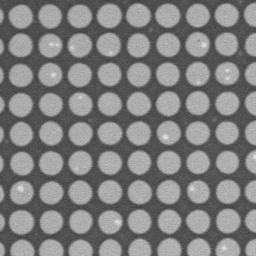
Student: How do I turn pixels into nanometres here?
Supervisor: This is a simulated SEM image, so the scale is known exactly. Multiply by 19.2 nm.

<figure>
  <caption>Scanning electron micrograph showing an array of small figures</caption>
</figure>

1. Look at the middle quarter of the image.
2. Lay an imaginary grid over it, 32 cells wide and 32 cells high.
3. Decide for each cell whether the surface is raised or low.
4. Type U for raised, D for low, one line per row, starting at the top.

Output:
DDUUUUDDDUUUUDDDDUUUUDDDUUUUDDDU
DUUUUUDDDUUUUUDDUUUUUDDUUUUUUDDU
DUUUUUUDDUUUUUDDUUUUUDDUUUUUUDDU
DUUUUUUDDUUUUUDDUUUUUDDUUUUUUDDU
DDUUUUDDDUUUUDDDUUUUUDDDUUUUDDDU
DDDUUDDDDDDDDDDDDDUUDDDDDDDDDDDD
DDDDDDDDDDDDDDDDDDDDDDDDDDDDDDDD
DDDUUDDDDDUUDDDDDUUUDDDDUUUUDDDD
DDUUUUDDDUUUUUDDUUUUUDDDUUUUUDDU
DUUUUUUDDUUUUUDDUUUUUDDUUUUUUDDU
DUUUUUUDDUUUUUDDUUUUUUDUUUUUUDDU
DDUUUUUDDUUUUUDDUUUUUDDDUUUUDDDU
DDDUUUDDDDUUUDDDDUUUDDDDDUUUDDDD
DDDDDDDDDDDDDDDDDDDDDDDDDDDDDDDD
DDDDDDDDDDDDDDDDDDDDDDDDDUUDDDDD
DDUUUUDDDUUUUUDDUUUUUDDDUUUUDDDU
DUUUUUUDDUUUUUDDUUUUUDDUUUUUUDDU
DUUUUUUDUUUUUUDDUUUUUDDUUUUUUDDU
DDUUUUUDDUUUUUDDUUUUUDDDUUUUUDDU
DDUUUUDDDDUUUDDDDUUUUDDDUUUUDDDU
DDDDDDDDDDDDDDDDDDDDDDDDDDDDDDDD
DDDDDDDDDDDDDDDDDDDDDDDDDDDDDDDD
DDUUUUDDDUUUUDDDDUUUUDDDUUUUDDDD
DUUUUUUDDUUUUUDDUUUUUDDDUUUUUDDU
DUUUUUUDDUUUUUDDUUUUUUDUUUUUUDDU
DUUUUUUDDUUUUUDDUUUUUDDDUUUUUDDU
DDUUUUDDDUUUUUDDDUUUUDDDUUUUDDDU
DDDUUDDDDDDUDDDDDDDDDDDDDDDDDDDD
DDDDDDDDDDDDDDDDDDDDDDDDDDDDDDDD
DDDUUDDDDDUUUDDDDUUUDDDDDUUUDDDD
DDUUUUDDDUUUUUDDUUUUUDDDUUUUUDDU
DUUUUUUDDUUUUUDDUUUUUUDUUUUUUDDU